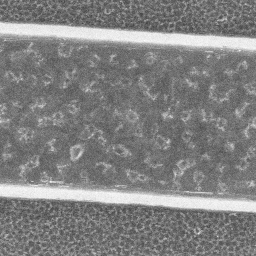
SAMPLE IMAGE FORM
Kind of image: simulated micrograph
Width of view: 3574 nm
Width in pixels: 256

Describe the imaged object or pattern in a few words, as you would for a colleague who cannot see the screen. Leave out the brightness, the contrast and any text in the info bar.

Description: one or a few lines or trenches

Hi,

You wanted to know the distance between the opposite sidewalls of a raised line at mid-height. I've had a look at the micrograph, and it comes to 2250 nanometres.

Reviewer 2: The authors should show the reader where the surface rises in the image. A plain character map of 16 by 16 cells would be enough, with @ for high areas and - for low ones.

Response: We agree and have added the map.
----------------
----------------
@@@@@@@@@@@-----
@@@@@@@@@@@@@@@@
@@@@@@@@@@@@@@@@
@@@@@@@@@@@@@@@@
@@@@@@@@@@@@@@@@
@@@@@@@@@@@@@@@@
@@@@@@@@@@@@@@@@
@@@@@@@@@@@@@@@@
@@@@@@@@@@@@@@@@
@@@@@@@@@@@@@@@@
----------@@@@@@
----------------
----------------
----------------